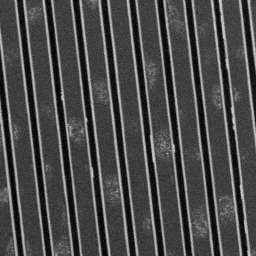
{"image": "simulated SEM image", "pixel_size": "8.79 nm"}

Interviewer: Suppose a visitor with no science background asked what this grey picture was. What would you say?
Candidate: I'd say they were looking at parallel lines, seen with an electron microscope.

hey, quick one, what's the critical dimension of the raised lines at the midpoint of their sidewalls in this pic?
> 179 nanometres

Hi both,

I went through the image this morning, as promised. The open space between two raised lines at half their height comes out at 0.0688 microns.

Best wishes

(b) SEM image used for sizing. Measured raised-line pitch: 245 nm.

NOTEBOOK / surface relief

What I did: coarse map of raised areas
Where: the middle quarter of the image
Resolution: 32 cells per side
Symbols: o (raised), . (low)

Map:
oooo..ooooo..ooooo..ooooo..ooooo
oooo..ooooo..ooooo..ooooo..ooooo
oooo..ooooo..ooooo..ooooo..ooooo
oooo..ooooo..ooooo..ooooo..ooooo
oooo..ooooo..ooooo..ooooo..ooooo
oooo..ooooo...oooo...oooo..ooooo
oooo...oooo...ooooo..oooo...oooo
ooooo..ooooo..ooooo..ooooo..oooo
ooooo..ooooo..ooooo..ooooo..oooo
ooooo..ooooo..ooooo..ooooo..oooo
ooooo..ooooo..ooooo..ooooo..oooo
ooooo..ooooo..ooooo..ooooo..oooo
ooooo..ooooo..ooooo..ooooo..oooo
ooooo..ooooo..ooooo...oooo..oooo
.oooo..ooooo...ooooo..oooo..oooo
.oooo...ooooo..ooooo..oooo...ooo
.ooooo..ooooo..ooooo..ooooo..ooo
.ooooo..ooooo..ooooo..ooooo..ooo
.ooooo..ooooo..ooooo..ooooo..ooo
.ooooo..ooooo..ooooo..ooooo..ooo
.ooooo..ooooo..ooooo..ooooo..ooo
.ooooo..ooooo..ooooo..ooooo..ooo
.ooooo...oooo..ooooo...oooo..ooo
..oooo...oooo...ooooo..oooo...oo
..oooo...ooooo..ooooo..ooooo..oo
..ooooo..ooooo..ooooo..ooooo..oo
..ooooo..ooooo..ooooo..ooooo..oo
..ooooo..ooooo..ooooo..ooooo..oo
..ooooo..ooooo..ooooo..ooooo..oo
..ooooo..ooooo..ooooo..ooooo..oo
..ooooo..ooooo..ooooo..ooooo..oo
...oooo..ooooo..ooooo...oooo..oo